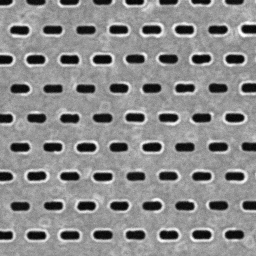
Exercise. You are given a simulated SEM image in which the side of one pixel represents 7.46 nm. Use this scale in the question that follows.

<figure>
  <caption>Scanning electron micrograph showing a regular array of holes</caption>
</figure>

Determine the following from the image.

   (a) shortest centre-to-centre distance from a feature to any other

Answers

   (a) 0.244 µm